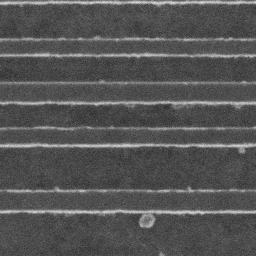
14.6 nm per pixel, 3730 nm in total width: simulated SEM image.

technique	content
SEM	lines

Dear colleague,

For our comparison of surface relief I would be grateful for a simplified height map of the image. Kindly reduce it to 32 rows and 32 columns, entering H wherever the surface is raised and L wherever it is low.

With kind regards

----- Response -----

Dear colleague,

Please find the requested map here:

LLLLLLLLLLLLLLLLLLLLLLLLLLLLLLLL
LLLLLLLLLLLLLLLLLLLLLLLLLLLLLLLL
LLLLLLLLLLLLLLLLLLLLLLLLLLLLLLLL
LLLLLLLLLLLLLLLLLLLLLLLLLLLLLLLL
LLLLLLLLLLLLLLLLLLLLLLLLLLLLLLLL
HHHHHHHHHHHHHHHHHHHHHHHHHHHHHHHH
HHHHHHHHHHHHHHHHHHHHHHHHHHHHHHHH
LLLLLLLLLLLLLLLLLLLLLLLLLLLLLLLL
LLLLLLLLLLLLLLLLLLLLLLLLLLLLLLLL
LLLLLLLLLLLLLLLLLLLLLLLLLLLLLLLL
HHHHHHHHHHHHHHHHHHHHHHHHHHHHHHHH
HHHHHHHHHHHHHHHHHHHHHHHHHHHHHHHH
HHHHHHHHHHHHHHHHHHHHHHHHHHHHHHHH
LLLLLLLLLLLLLLLLLLLLLLLLLLLLLLLL
LLLLLLLLLLLLLLLLLLLLLLLLLLLLLLLL
LLLLLLLLLLLLLLLLLLLLLLLLLLLLLLLL
HHHHHHHHHHHHHHHHHHHHHHHHHHHHHHHH
HHHHHHHHHHHHHHHHHHHHHHHHHHHHHHHH
LLLLLLLLLLLLLLLLLLLLLLLLLLLLLLLL
LLLLLLLLLLLLLLLLLLLLLLLLLLLLLLLL
LLLLLLLLLLLLLLLLLLLLLLLLLLLLLLLL
LLLLLLLLLLLLLLLLLLLLLLLLLLLLLLLL
LLLLLLLLLLLLLLLLLLLLLLLLLLLLLLLL
LLLLLLLLLLLLLLLLLLLLLLLLLLLLLLLL
HHHHHHHHHHHHHHHHHHHHHHHHHHHHHHHH
HHHHHHHHHHHHHHHHHHHHHHHHHHHHHHHH
LLLLLLLLLLHHLLLLLLLLHHHHHHHHLLLH
LLLLLLLLLLLLLLLLLLHLLLLLLLLLLLLL
LLLLLLLLLLLLLLLLLLLLLLLLLLLLLLLL
LLLLLLLLLLLLLLLLLLLLLLLLLLLLLLLL
LLLLLLLLLLLLLLLLLLLLLLLLLLLLLLLL
LLLLLLLLLLLLLLLLLLLLLLLLLLLLLLLL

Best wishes